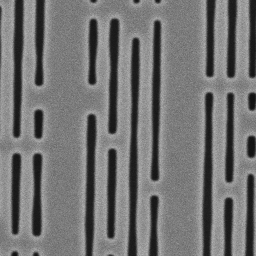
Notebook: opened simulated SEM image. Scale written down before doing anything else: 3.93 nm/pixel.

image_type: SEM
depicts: groups of lines, slits or small figures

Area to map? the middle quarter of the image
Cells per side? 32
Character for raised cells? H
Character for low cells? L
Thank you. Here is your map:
HHHHHHLLHHHLLHHHHLLHHHLLHHHHHHHH
HHHHHHLLHHHLLHHHHLLHHHLLHHHHHHHH
HHHHHHLLHHHLLHHHHLLHHHLLHHHHHHHH
HHHHHHLLHHHLLHHHHLLHHHLLHHHHHHHH
HHHHHHLLHHHLLHHHHLLHHHLLHHHHHHHH
HHHHHHHHHHHLLHHHHLLHHHLLHHHHHHHH
HHHHHHHHHHHLLHHHHLLHHHLLHHHHHHHH
HHHHHHHHHHHLLHHHHLLHHHLLHHHHHHHH
HHHHHHHHHHHLLHHHHLLHHHLLHHHHHHHH
HHHHHHHHHHHLLHHHHLLHHHLLHHHHHHHH
HHHHHHHHHHHLLHHHHLLHHHLLHHHHHHHH
HHHHHHHHHHHLLHHHHLLHHHLLHHHHHHHH
HHHHHHHHHHHLLHHHHLLHHHLLHHHHHHHH
HHHHHHLLHHHLLHHHHLLHHHLLHHHHHHHH
HHHHHHLLHHHLLHHHHLLHHHLLHHHHHHHH
HHHHHHLLHHHLLHHHHLHHHHLLHHHHHHHH
HHHHHLLLHHHLLHHHHLHHHHLLHHHHHHHH
HHHHHLLLHHHHHHHHHLHHHHLLHHHHHHHH
HHHHHLLLHHHHHHHHHLHHHHLLHHHHHHHH
HHHHHLLLHHHHHHHHHLHHHHLLHHHHHHHH
HHHHHLLLHHHHHHHHHLHHHHLLHHHHHHHH
HHHHHLLLHHHLLHHHLLLHHHLLHHHHHHHH
HHHHHLLLHHHLLHHHLLLHHHLLHHHHHHHH
HHHHHLLLHHHLLHHHLLLHHHLLHHHHHHHH
HHHHHLLLHHHLLHHHLLLHHHLLHHHHHHHH
HHHHHLLLHHHLLHHHLLLHHHLLHHHHHHHH
HHHHHLLLHHHLLHHHLLLHHHLLHHHHHHHH
HHHHHLLLHHHLLHHHLLLHHHLLHHHHHHHH
HHHHHLLLHHHLLHHHLLLHHHLLHHHHHHHH
HHHHHLLLHHHLLHHHLLLHHHHHHHHHHHHH
HHHHHLLLHHHLLHHHLLLHHHHHHHHHHHHH
HHHHHLLLHHHLLHHHLLLHHHHHHHHHHHHH